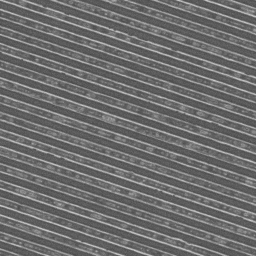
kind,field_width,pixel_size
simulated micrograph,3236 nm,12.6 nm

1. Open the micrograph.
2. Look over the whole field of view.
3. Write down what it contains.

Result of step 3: parallel lines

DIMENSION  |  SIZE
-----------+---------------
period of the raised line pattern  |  206 nm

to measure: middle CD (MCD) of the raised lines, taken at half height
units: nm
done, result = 88.5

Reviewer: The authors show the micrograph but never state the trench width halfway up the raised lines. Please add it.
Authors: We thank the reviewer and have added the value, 114 nanometres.